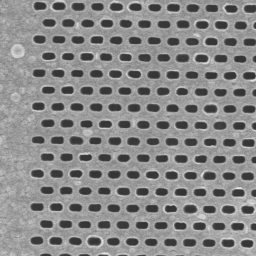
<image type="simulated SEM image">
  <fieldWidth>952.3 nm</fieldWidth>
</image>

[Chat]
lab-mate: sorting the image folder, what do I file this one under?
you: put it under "a regular array of holes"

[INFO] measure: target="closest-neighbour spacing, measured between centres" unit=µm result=0.0702